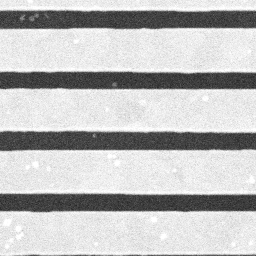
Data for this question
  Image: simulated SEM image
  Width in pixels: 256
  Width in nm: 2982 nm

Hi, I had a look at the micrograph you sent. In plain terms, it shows lines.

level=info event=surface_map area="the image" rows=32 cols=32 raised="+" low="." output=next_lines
++++++++++++++++++++++++++++++++
................................
................................
................................
++++++++++++++++++++++++++++++++
++++++++++++++++++++++++++++++++
++++++++++++++++++++++++++++++++
++++++++++++++++++++++++++++++++
++++++++++++++++++++++++++++++++
................................
................................
++++++++++++++++++++++++++++++++
++++++++++++++++++++++++++++++++
++++++++++++++++++++++++++++++++
++++++++++++++++++++++++++++++++
++++++++++++++++++++++++++++++++
.........................+++++++
................................
................................
++++++++++++++++++++++++++++++++
++++++++++++++++++++++++++++++++
++++++++++++++++++++++++++++++++
++++++++++++++++++++++++++++++++
++++++++++++++++++++++++++++++++
................................
................................
................................
++++++++++++++++++++++++++++++++
++++++++++++++++++++++++++++++++
++++++++++++++++++++++++++++++++
++++++++++++++++++++++++++++++++
++++++++++++++++++++++++++++++++